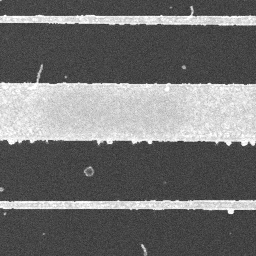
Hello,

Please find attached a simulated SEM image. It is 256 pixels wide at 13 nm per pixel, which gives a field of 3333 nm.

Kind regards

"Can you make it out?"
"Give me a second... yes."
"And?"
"lines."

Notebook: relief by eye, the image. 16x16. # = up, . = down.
................
...............#
................
................
................
################
################
################
################
................
................
................
................
................
................
................